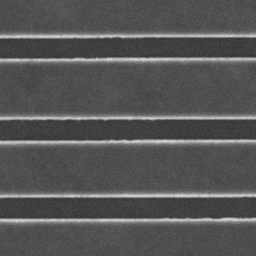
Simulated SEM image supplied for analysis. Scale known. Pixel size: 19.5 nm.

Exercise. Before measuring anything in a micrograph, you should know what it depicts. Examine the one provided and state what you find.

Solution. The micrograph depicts lines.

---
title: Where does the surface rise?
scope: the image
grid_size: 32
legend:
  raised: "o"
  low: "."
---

oooooooooooooooooooooooooooooooo
oooooooooooooooooooooooooooooooo
oooooooooooooooooooooooooooooooo
oooooooooooooooooooooooooooooooo
oooooooooooooooooooooooooooooooo
................................
................................
oooooooooooooooooooooooooooooooo
oooooooooooooooooooooooooooooooo
oooooooooooooooooooooooooooooooo
oooooooooooooooooooooooooooooooo
oooooooooooooooooooooooooooooooo
oooooooooooooooooooooooooooooooo
oooooooooooooooooooooooooooooooo
oooooooooooooooooooooooooooooooo
................................
................................
................................
oooooooooooooooooooooooooooooooo
oooooooooooooooooooooooooooooooo
oooooooooooooooooooooooooooooooo
oooooooooooooooooooooooooooooooo
oooooooooooooooooooooooooooooooo
oooooooooooooooooooooooooooooooo
ooooooooooooooo.o...............
................................
................................
o...oooooooooooooooooooooooooooo
oooooooooooooooooooooooooooooooo
oooooooooooooooooooooooooooooooo
oooooooooooooooooooooooooooooooo
oooooooooooooooooooooooooooooooo